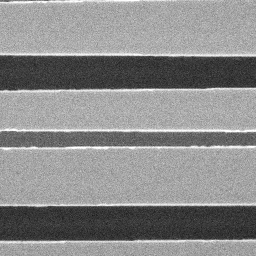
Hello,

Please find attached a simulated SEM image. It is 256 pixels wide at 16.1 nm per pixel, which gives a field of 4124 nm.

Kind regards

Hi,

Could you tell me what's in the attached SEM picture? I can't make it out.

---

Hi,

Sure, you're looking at lines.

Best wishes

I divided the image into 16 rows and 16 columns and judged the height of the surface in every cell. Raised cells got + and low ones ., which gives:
++++++++++++++++
++++++++++++++++
++++++++++++++++
................
................
................
++++++++++++++++
++++++++++++++++
++++++++++++++++
++++++++++++++++
++++++++++++++++
++++++++++++++++
++++++++++++++++
................
................
++++++++++++++++